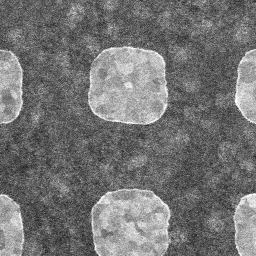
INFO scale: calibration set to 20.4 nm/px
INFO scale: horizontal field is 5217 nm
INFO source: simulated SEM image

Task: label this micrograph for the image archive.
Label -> raised bodies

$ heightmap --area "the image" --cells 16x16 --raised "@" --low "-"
----------------
----------------
----------------
@-----@@@@-----@
@-----@@@@-----@
@-----@@@@-----@
@-----@@@@-----@
@------@@@------
----------------
----------------
----------------
----------------
@-----@@@@-----@
@-----@@@@@----@
@-----@@@@-----@
@-----@@@@-----@